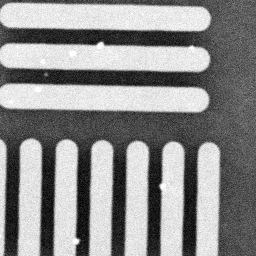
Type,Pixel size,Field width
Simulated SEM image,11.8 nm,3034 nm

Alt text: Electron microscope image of groups of lines, slits or small figures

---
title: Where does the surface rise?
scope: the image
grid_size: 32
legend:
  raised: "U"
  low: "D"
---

DUUUUDDDDDDDDDDDDDDDDDDDDDDDDDDD
UUUUUUUUUUUUUUUUUUUUUUUUUUDDDDDD
UUUUUUUUUUUUUUUUUUUUUUUUUUDDDDDD
DDDDDDDUUUUUUUUUUUUUUUUUUUDDDDDD
DDDDDDDDDDDDDDDDDDDDDDDDDDDDDDDD
DDDDDDDDDDDDDDDDDDDDDDDDDDDDDDDD
UUUUUUUUUUUUUUUUUUUUUUUUUUDDDDDD
UUUUUUUUUUUUUUUUUUUUUUUUUUDDDDDD
DDDUUUUUUUUUUUUUUUUUUUUUUUDDDDDD
DDDDDDDDDDDDDDDDDDDDDDDDDDDDDDDD
DDDDDDDDDDDDDDDDDDDDDDDDDDDDDDDD
UUUUUUUUUUUUUUUUUUUUUUUUUUDDDDDD
UUUUUUUUUUUUUUUUUUUUUUUUUUDDDDDD
DDDDDDUUUUUUUUUUUUUUUUUUUUDDDDDD
DDDDDDDDDDDDDDDDDDDDDDDDDDDDDDDD
DDDDDDDDDDDDDDDDDDDDDDDDDDDDDDDD
DDDDDDDDDDDDDDDDDDDDDDDDDDDDDDDD
DDDUDDDDDDDDDDDDDDDDDDDDDDDDDDDD
UDDUUDDUUUDUUUDDUUDDUUUDDUUDDDDD
UDDUUDDUUUDUUUDDUUUDUUUDDUUDDDDD
UDDUUDDUUUDUUUDDUUUDUUUDDUUDDDDD
UDDUUDDUUDDUUUDDUUDDUUUDDUUDDDDD
UDDUUDDUUDDUUUDDUUDDUUUDDUUDDDDD
UDUUUDDUUDDUUUDDUUDDUUUDDUUDDDDD
UDUUUDDUUDDUUUDDUUDDUUUDDUUDDDDD
UDUUUDDUUDDUUUDDUUDDUUUDDUUDDDDD
UDUUUDDUUDDUUUDDUUDDUUUDDUUDDDDD
DDUUUDDUUDDUUUDDUUDDUUUDDUUDDDDD
DDUUUDDUUDDUUUDDUUDDUUUDDUUDDDDD
DDUUUDDUUUDUUUDDUUDDUUUDDUUDDDDD
DDUUUDDUUUDUUUDDUUDDUUUDDUUDDDDD
DDUUUDDUUDDUUUDDUUDDUUUDDUUDDDDD